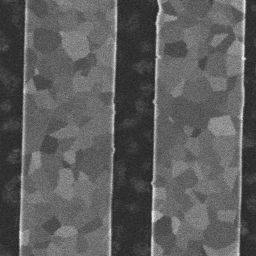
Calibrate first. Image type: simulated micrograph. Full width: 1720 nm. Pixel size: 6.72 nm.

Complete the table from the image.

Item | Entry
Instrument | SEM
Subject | one or a few lines or trenches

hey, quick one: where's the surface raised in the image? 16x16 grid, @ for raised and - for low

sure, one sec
--@@@@@---@@@@@-
--@@@@@---@@@@@-
--@@@@@---@@@@@-
--@@@@@---@@@@@-
--@@@@@---@@@@@-
--@@@@@---@@@@@-
--@@@@@---@@@@@-
-@@@@@@---@@@@@-
-@@@@@@---@@@@@-
-@@@@@@---@@@@@-
-@@@@@@---@@@@@-
-@@@@@@---@@@@@-
-@@@@@@---@@@@@-
-@@@@@@---@@@@@-
-@@@@@@---@@@@@-
-@@@@@@---@@@@@-